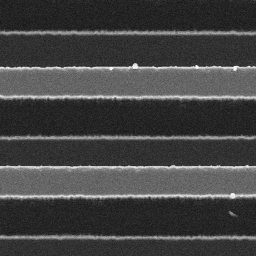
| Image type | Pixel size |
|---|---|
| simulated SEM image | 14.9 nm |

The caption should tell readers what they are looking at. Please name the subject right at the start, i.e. lines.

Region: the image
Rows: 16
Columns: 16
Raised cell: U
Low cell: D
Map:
DDDDDDDDDDDDDDDD
DDDDDDDDDDDDDDDD
UUUUUUUUUUUUUUUU
UUUUUUUUUUUUUUUU
UUUUUUUUUUUUUUUU
UUUUUUUUUUUUUUUU
DDDDDDDDDDDDDDDD
DDDDDDDDDDDDDDDD
DDDDDDDDDDDDDDDD
UUUUUUUUUUUUUUUU
UUUUUUUUUUUUUUUU
UUUUUUUUUUUUUUUU
DDDDDDDDDDDDDDDD
DDDDDDDDDDDDDDDD
DDDDDDDDDDDDDDDD
UUUUUUUUUUUUUUUU